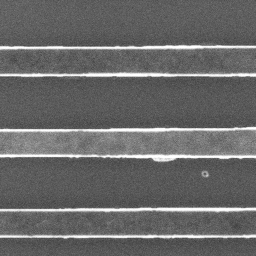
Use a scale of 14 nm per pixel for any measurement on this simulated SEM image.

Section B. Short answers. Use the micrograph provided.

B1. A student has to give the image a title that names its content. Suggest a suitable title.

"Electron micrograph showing lines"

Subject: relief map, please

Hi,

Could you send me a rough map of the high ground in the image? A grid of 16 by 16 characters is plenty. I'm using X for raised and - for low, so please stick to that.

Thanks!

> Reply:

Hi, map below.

----------------
----------------
----------------
XXXXXXXXXXXXXXXX
XXXXXXXXXXXXXXXX
----------------
----------------
----------------
XXXXXXXXXXXXXXXX
XXXXXXXXXXXXXXXX
----------------
----------------
----------------
XXXXXXXXXXXXXXXX
XXXXXXXXXXXXXXXX
----------------